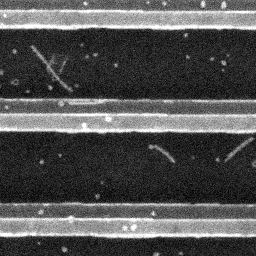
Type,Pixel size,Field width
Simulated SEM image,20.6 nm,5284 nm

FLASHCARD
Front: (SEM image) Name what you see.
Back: lines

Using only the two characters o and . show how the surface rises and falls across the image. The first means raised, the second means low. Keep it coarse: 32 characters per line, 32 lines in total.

oooooooooooooooooooooooooooooooo
oooooooooooooooooooooooooooooooo
oooooooooooooooooooooooooooooooo
................................
................................
................................
................................
................................
................................
................................
................................
................................
ooo.ooooo..o....................
oooooooooooooooooooooooooooooooo
oooooooooooooooooooooooooooooooo
oooooooooooooooooooooooooooooooo
................................
................................
................................
................................
................................
................................
................................
................................
................................
................................
oooooooooooooooooooooooooooooooo
oooooooooooooooooooooooooooooooo
oooooooooooooooooooooooooooooooo
................................
................................
................................